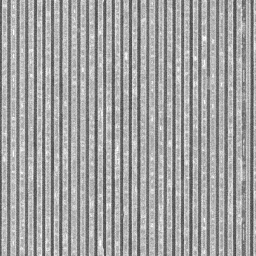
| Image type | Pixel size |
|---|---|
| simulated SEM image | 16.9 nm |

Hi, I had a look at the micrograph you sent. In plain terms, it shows parallel lines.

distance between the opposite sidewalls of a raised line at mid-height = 0.0867 µm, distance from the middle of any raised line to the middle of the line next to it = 0.147 µm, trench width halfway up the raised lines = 0.0592 micrometres